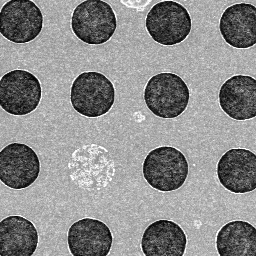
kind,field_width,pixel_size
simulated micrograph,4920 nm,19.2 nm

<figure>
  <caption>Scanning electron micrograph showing holes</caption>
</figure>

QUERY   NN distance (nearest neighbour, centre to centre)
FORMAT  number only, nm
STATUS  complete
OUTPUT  1400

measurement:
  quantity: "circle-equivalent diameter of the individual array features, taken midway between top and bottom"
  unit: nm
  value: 868